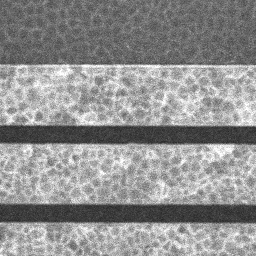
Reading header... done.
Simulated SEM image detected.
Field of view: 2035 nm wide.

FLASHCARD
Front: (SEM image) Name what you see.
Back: one or a few lines or trenches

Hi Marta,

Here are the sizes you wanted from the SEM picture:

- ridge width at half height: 475 nanometres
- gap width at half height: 154 nanometers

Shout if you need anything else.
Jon